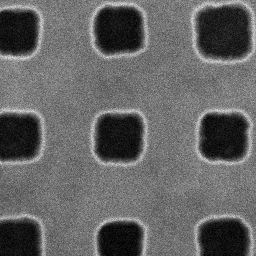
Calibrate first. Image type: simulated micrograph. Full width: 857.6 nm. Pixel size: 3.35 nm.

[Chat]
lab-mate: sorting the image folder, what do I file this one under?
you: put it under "holes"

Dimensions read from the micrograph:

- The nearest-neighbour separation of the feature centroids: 350 nm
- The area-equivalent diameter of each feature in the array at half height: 170 nanometres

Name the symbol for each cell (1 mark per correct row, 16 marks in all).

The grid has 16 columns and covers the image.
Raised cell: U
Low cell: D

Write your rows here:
UUUUUUUDUUUUUDDU
DDUUUUDDDUUUDDDD
DDUUUUDDDUUUDDDD
UUUUUUUUUUUUUDDU
UUUUUUUUUUUUUUUU
UUUUUUUUUUUUUUUU
UUUUUUUUUUUUUUUU
DDUUUUDDDUUUUDDU
DDUUUUDDDUUUUDDU
DDUUUUDDDUUUUDDU
UUUUUUUUUUUUUUUU
UUUUUUUUUUUUUUUU
UUUUUUUUUUUUUUUU
UUUUUUUUUUUUUUUU
DDUUUUDDDUUUUDDU
DDDUUUDDDUUUUDDU